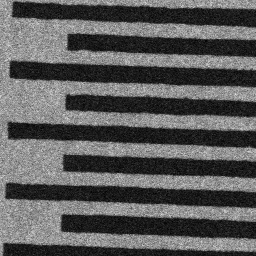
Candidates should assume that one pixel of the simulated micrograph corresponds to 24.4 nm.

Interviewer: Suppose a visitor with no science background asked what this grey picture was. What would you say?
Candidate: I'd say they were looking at parallel lines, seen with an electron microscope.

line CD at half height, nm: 405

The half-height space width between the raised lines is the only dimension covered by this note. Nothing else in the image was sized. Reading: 314 nm